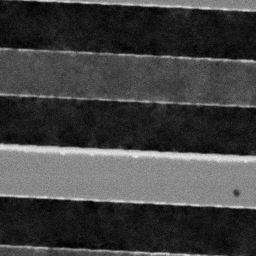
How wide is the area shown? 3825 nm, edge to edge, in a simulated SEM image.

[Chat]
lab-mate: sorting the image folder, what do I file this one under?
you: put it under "lines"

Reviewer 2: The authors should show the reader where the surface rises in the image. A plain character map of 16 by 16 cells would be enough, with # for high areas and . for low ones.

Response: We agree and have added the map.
............####
................
................
##########......
################
################
............####
................
................
##########......
################
################
.....###########
................
................
###.............